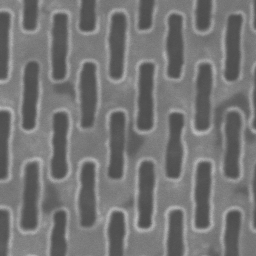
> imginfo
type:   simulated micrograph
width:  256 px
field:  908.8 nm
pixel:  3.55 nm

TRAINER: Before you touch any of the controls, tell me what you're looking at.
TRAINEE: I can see a regular array of holes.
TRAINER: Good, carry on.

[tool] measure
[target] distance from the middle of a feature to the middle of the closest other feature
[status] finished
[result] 199 nm